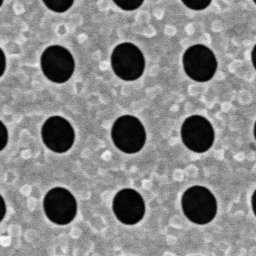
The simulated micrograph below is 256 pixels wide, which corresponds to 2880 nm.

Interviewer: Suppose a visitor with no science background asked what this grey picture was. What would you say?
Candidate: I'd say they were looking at a regular array of holes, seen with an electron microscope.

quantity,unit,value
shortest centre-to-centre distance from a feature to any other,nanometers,792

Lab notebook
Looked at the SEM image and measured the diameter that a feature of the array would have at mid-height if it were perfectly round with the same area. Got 410 nanometres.